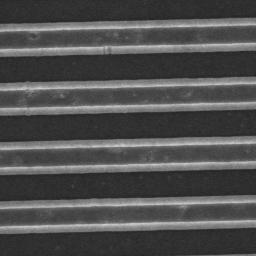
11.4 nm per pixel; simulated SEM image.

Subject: parallel lines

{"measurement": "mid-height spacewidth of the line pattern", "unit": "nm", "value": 395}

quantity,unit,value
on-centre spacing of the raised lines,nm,674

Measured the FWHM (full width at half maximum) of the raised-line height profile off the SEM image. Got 281 nm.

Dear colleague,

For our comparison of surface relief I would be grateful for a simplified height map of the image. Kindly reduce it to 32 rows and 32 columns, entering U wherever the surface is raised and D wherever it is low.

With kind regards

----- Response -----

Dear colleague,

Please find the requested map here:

DDDDDDDDDDDDDDDDDDDDDDDDDDDDDDDD
DDDDDDDDDDDDDDDDDDDDDDDDDDDDDDDD
DDDDDDDDDDDDDDDDDDDDDDDDDDDDDDDD
DDUUUUUUUUUUUUUUUUUUUUUUUUUUUUUU
UUUUUUUUUUUUUUUUUUUUUUUUUUUUUUUU
UUUUUUUUUUUUUUUUUUUUUUUUUUUUUUUU
UDDDUDDDDDDDDDDDDDDDDDDDDDDDDDDD
DDDDDDDDDDDDDDDDDDDDDDDDDDDDDDDD
DDDDDDDDDDDDDDDDDDDDDDDDDDDDDDDD
DDDDDDDDDDDDDDDDDDDDDDDDDDDDDDDD
DDDDDDDDDDDDDDDDDDDUUUUUUUUUUUUU
UUUUUUUUUUUUUUUUUUUUUUUUUUUUUUUU
UUUUUUUUUUUUUUUUUUUUUUUUUUUUUUUU
UUUUUUUUUUUUUUUUUDDDDDDDDDDDDDDD
DDDDDDDDDDDDDDDDDDDDDDDDDDDDDDDD
DDDDDDDDDDDDDDDDDDDDDDDDDDDDDDDD
DDDDDDDDDDDDDDDDDDDDDDDDDDDDDDDD
DDDDDDDDDDDDDDDDDDDDDDDDDDDDDDDD
UUUUUUUUUUUUUUUUUUUUUUUUUUUUUUUU
UUUUUUUUUUUUUUUUUUUUUUUUUUUUUUUU
UUUUUUUUUUUUUUUUUUUUUUUUUUUUUUUU
DDDDDDDDDDDDDDDDDDDDDDDDDDDDDDDD
DDDDDDDDDDDDDDDDDDDDDDDDDDDDDDDD
DDDDDDDDDDDDDDDDDDDDDDDDDDDDDDDD
DDDDDDDDDDDDDDDDDDDDDDDDDDDDDDDD
DDDDDDDUUUUUUUUUUUUUUUUUUUUUUUUU
UUUUUUUUUUUUUUUUUUUUUUUUUUUUUUUU
UUUUUUUUUUUUUUUUUUUUUUUUUUUUUUUU
UUUUUUUUUUDDDDDDDDDDDDDDDDDDDDDD
DDDDDDDDDDDDDDDDDDDDDDDDDDDDDDDD
DDDDDDDDDDDDDDDDDDDDDDDDDDDDDDDD
DDDDDDDDDDDDDDDDDDDDDDDDDDDDDDDD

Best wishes